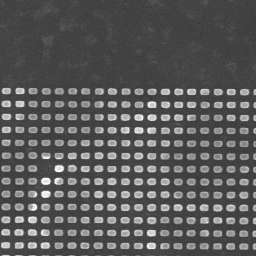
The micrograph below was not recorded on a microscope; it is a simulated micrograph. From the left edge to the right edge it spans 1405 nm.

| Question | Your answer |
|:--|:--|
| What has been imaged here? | a regular array of raised bodies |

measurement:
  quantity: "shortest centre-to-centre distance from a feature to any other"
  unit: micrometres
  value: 0.0705